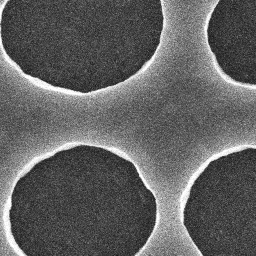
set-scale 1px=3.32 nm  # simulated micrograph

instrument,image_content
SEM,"holes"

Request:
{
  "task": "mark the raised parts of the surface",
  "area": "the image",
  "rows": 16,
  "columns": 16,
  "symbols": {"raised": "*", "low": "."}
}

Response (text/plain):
..........***...
..........***...
..........***...
..........***...
*........*****..
****...*********
****************
****************
****************
***....*******..
**......*****...
*........***....
*.........**....
*.........*.....
*.........**....
*........***....